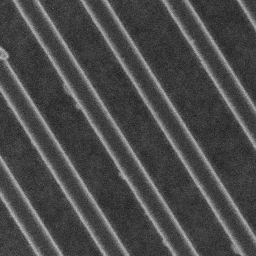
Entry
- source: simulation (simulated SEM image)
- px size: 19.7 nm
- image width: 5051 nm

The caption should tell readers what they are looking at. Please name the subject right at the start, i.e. lines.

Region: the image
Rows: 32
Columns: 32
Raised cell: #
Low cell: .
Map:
..###......###.......###......##
...###.....###.......###.......#
...###......###.......###......#
....###.....###........###......
....###......###.......###......
.....###......###.......###.....
#.....###.....###.......###.....
#.....###......###.......###....
#......###......###.......###...
##......###.....###.......###...
###.....###......###.......###..
###......###.....###........###.
.###......##......###.......###.
..##......###......###.......###
..###......###.....###.......###
...###.....###......###.......##
...###......###......###.......#
....###......###.....###.......#
.....###.....###......###.......
.....###......###......##.......
#.....###......###.....###......
#......##......###......###.....
##.....###......###.....###.....
##......###.....###......###....
###.....###......###......###...
.###.....###......###.....###...
.###......###.....###......###..
..###.....###......###.....###..
...###.....###......###.....###.
...###......###.....###......###
....###.....###......###.....###
....###......###......##......##